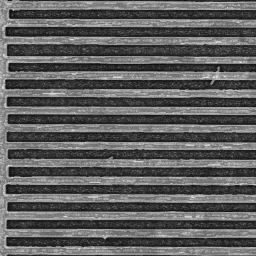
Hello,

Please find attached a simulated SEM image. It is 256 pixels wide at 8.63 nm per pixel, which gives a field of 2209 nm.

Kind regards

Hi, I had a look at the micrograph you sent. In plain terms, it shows parallel lines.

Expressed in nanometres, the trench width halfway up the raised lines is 88.4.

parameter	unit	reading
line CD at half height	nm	63.6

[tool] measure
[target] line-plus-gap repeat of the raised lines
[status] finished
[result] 0.151 micrometres